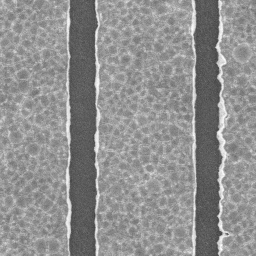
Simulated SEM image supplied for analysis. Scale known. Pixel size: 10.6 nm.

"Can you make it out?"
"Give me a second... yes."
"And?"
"one or a few lines or trenches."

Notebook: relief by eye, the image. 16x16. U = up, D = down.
UUUUDDUUUUUUDDUU
UUUUDDUUUUUUDDUU
UUUUDDUUUUUUDDUU
UUUUDDUUUUUUDDUU
UUUUDDUUUUUUDDUU
UUUUDDUUUUUUDDUU
UUUUDDUUUUUUDDUU
UUUUDDUUUUUUDDUU
UUUUDDUUUUUUDDUU
UUUUDDUUUUUUDDUU
UUUUDDUUUUUUDDUU
UUUUDDUUUUUUDDUU
UUUUDDUUUUUUDDUU
UUUUDDUUUUUUDDUU
UUUUDDUUUUUUDDUU
UUUUDDUUUUUUDDUU